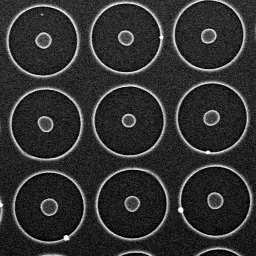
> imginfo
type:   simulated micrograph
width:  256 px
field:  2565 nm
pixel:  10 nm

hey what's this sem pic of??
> an array of small figures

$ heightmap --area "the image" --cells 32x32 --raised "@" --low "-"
@@@@@@@@@@@@@@@--@@@@@@@----@@@@
@@@-----@@@@@------@@@@------@@@
@@-------@@@-------@@@--------@@
@--------@@@--------@@--------@@
@---------@---------@@--------@@
@---------@@--------@@--------@@
@--------@@@--------@@--------@@
@@-------@@@-------@@@@------@@@
@@@-----@@@@@@----@@@@@@@--@@@@@
@@@@@@@@@@@@@@@@@@@@@@@@@@@@@@@@
@@@@@@@@@@@@@@@@@@@@@@@@@@-@@@@@
@@@@---@@@@@@@-----@@@@@-----@@@
@@@------@@@@-------@@@-------@@
@@--------@@--------@@---------@
@@--------@@--------@@---------@
@---------@@--------@@---------@
@@--------@@--------@@@-------@@
@@--------@@@-------@@@-------@@
@@-------@@@@------@@@@@-----@@@
@@@@----@@@@@@@@@@@@@@@@@@@@@@@@
@@@@@@@@@@@@@@@@@@@@@@@@@@@@@@@@
@@@@@@@@@@@@@@@----@@@@@@----@@@
@@@------@@@@-------@@@-------@@
@@@-------@@@-------@@@--------@
@@--------@@---------@@--------@
@@--------@@---------@@--------@
@@--------@@---------@@--------@
@@--------@@@-------@@@--------@
@@@-------@@@-------@@@@------@@
@@@@----@@@@@@@---@@@@@@@@@@@@@@
@@@@@@@@@@@@@@@@@@@@@@@@@@@@@@@@
@@@@@@@@@@@@@@@@@@@@@@@@@@---@@@